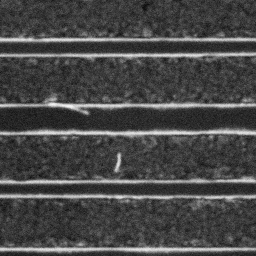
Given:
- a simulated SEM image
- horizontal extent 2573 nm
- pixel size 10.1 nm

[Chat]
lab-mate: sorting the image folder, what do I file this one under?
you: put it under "lines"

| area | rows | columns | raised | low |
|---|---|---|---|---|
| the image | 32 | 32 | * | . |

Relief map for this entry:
................................
................................
................................
................................
................................
********************************
********************************
................................
................................
................................
................................
................................
................................
********************************
********************************
********************************
********************************
................................
................................
................................
................................
................................
................................
********************************
********************************
................................
................................
................................
................................
................................
................................
********************************